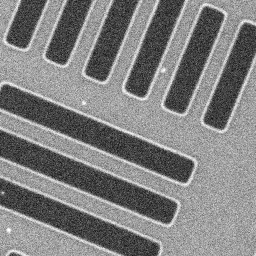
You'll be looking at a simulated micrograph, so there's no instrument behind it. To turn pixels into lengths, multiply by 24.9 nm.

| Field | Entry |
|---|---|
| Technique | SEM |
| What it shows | groups of lines, slits or small figures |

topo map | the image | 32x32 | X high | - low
--XXXX--XXXX--XXX--XXXX---------
--XXXX--XXX--XXXX--XXXX--XXX----
-XXXX--XXXX--XXXX--XXX--XXXX----
-XXXX--XXX---XXX--XXXX--XXXX--XX
-XXX--XXXX--XXXX--XXXX--XXX--XXX
-XXX--XXXX--XXX--XXXX--XXXX--XXX
------XXX--XXXX--XXXX--XXXX--XXX
------XXX--XXXX--XXX--XXXX--XXXX
----------XXXX--XXXX--XXXX--XXX-
-----------XXX--XXXX--XXX--XXXX-
X--------------XXXX--XXXX--XXXX-
XXXX------------XXX--XXX---XXX--
XXXXXX--------------XXXX--XXXX--
XXXXXXXXX------------XXX--XXX---
--XXXXXXXXX--------------XXXX---
----XXXXXXXXXX-----------XXXX---
X------XXXXXXXXX----------------
XXXX-----XXXXXXXXXX-------------
XXXXXX-----XXXXXXXXXX-----------
XXXXXXXXX-----XXXXXXXXX---------
--XXXXXXXXX-----XXXXXXXXX-------
----XXXXXXXXXX-----XXXXX--------
X-----XXXXXXXXXX-----XXX--------
XXXX-----XXXXXXXXX--------------
XXXXXX-----XXXXXXXXXX-----------
XXXXXXXXX-----XXXXXXXX----------
-XXXXXXXXXX-----XXXXXX----------
----XXXXXXXXX------XXX----------
------XXXXXXXXXX----------------
---------XXXXXXXXX--------------
-----------XXXXXXXXX------------
-X------------XXXXXX------------